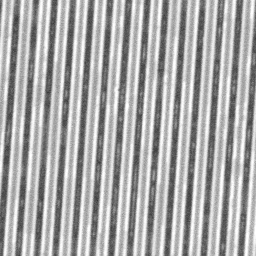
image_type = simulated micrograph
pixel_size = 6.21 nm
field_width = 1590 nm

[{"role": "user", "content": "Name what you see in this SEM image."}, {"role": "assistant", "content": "parallel lines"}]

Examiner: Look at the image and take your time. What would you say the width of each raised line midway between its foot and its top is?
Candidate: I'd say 59.6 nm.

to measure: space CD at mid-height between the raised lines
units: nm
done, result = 53.4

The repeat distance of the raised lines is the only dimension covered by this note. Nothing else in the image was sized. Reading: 115 nm